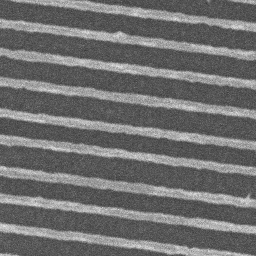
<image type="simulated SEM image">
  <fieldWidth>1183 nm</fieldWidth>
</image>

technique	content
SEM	parallel lines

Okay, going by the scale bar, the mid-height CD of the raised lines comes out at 37.2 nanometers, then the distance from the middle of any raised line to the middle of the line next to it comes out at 28.9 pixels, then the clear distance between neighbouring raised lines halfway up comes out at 98.5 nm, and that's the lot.